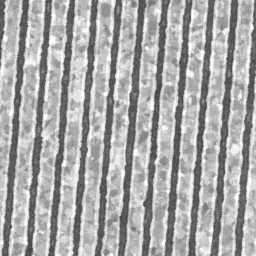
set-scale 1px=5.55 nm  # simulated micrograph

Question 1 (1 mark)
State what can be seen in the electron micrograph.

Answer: parallel lines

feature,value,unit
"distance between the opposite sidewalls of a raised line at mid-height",78.9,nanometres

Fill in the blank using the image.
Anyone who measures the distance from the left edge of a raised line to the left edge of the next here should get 129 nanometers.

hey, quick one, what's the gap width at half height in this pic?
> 49.1 nm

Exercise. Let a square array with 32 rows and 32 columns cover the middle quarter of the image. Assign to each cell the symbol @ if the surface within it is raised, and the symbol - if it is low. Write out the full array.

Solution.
--@@@---@@@---@@@--@@@@--@@@@--@
--@@@---@@@--@@@@--@@@@--@@@@--@
--@@@--@@@@--@@@@--@@@@--@@@@--@
--@@@--@@@@--@@@@--@@@---@@@---@
--@@@--@@@@--@@@@--@@@@--@@@---@
-@@@@--@@@@--@@@@--@@@@--@@@---@
-@@@@--@@@@--@@@@--@@@@--@@@--@@
-@@@@--@@@@--@@@---@@@--@@@@--@@
-@@@@--@@@---@@@---@@@--@@@@--@@
-@@@---@@@---@@@---@@@--@@@@--@@
-@@@@--@@@---@@@---@@@--@@@@--@@
-@@@---@@@---@@@--@@@@--@@@@--@@
-@@@---@@@---@@@--@@@@--@@@---@@
-@@@---@@@---@@@--@@@@--@@@@--@@
-@@@---@@@--@@@@--@@@@--@@@@--@@
-@@@---@@@--@@@@--@@@---@@@---@@
-@@@---@@@--@@@@--@@@---@@@---@@
-@@@--@@@@--@@@---@@@@--@@@---@@
@@@@--@@@@--@@@---@@@---@@@--@@@
@@@@--@@@@--@@@---@@@---@@@--@@@
@@@@--@@@@--@@@---@@@---@@@--@@@
@@@@--@@@---@@@---@@@---@@@--@@@
@@@@--@@@---@@@---@@@---@@@--@@@
@@@@--@@@@--@@@--@@@@--@@@@--@@@
@@@---@@@---@@@--@@@@--@@@@--@@@
@@@---@@@---@@@--@@@@--@@@@--@@@
@@@---@@@--@@@@--@@@@--@@@@--@@@
@@@---@@@--@@@@--@@@@--@@@---@@@
@@@---@@@--@@@@--@@@@--@@@---@@@
@@@---@@@--@@@@--@@@@--@@@---@@@
@@@---@@@--@@@@--@@@@--@@@--@@@@
@@@---@@---@@@---@@@---@@@--@@@@